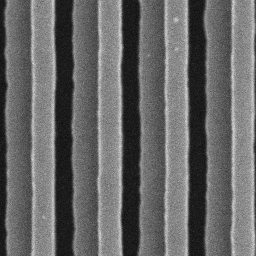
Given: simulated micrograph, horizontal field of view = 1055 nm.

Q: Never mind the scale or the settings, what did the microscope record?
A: lines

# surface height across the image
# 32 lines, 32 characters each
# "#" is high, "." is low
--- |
.######..######...#####...######
.######..######...#####...######
.######..######...#####...######
.######..######...#####...######
.######..######...#####...######
.######..######..#######..######
.######..######..######...######
.######..######..######...######
.######..######..######...######
.######..######..######...######
.######..######...#####...######
.######..######...#####...######
.######..######...#####...######
.######..######...######..######
.######..######...#####...######
.######..######...#####...######
.######..######...######..######
.######..######...######..######
.######..######...######..######
.######..######...#####...######
.######..######...#####...######
.######..######...######..######
.######..######...######..######
.######..######...######..######
.######..######...#####...######
.######..######...#####...######
.######..######...#####...######
.######..######...#####...######
.######..######...#####...######
.######..######...#####...######
.######..######...#####...######
.######..######..######...######